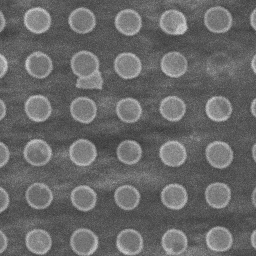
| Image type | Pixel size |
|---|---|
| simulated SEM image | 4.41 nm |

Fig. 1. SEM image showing a regular array of raised bodies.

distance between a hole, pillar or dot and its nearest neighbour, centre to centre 190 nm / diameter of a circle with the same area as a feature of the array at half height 108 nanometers